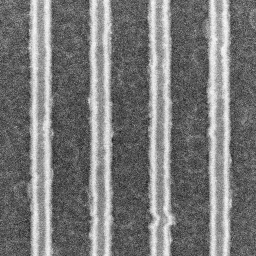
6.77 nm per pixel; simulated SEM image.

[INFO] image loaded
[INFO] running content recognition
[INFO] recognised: parallel lines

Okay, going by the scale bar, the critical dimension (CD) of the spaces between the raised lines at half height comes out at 0.315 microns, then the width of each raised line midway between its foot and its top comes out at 13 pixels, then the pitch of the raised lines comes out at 402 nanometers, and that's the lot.